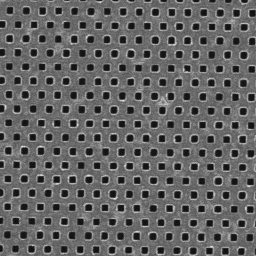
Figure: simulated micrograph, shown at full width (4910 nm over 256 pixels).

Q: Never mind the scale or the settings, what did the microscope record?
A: a regular array of holes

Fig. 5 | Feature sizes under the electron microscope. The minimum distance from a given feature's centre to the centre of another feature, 0.302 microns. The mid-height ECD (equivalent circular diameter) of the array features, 148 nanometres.